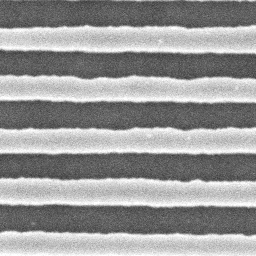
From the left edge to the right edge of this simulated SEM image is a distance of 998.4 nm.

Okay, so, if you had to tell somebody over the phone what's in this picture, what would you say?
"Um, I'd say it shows lines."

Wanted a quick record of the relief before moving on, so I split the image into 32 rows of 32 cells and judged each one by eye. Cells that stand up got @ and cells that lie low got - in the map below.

--------------------------------
--------------------------------
--------------------------------
----@@@@@@@@@@@@@@@@@@@--@@@@@@@
@@@@@@@@@@@@@@@@@@@@@@@@@@@@@@@@
@@@@@@@@@@@@@@@@@@@@@@@@@@@@@@@@
-----------------------@@--@@@@@
--------------------------------
--------------------------------
@@-@-@@---------@---------------
@@@@@@@@@@@@@@@@@@@@@@@@@@@@@@@@
@@@@@@@@@@@@@@@@@@@@@@@@@@@@@@@@
------@@@@@@@@-@@@@@@@@@@@@@@@@@
--------------------------------
--------------------------------
--------------------------------
@@@@@@@@@@@@@@@@@@@@@@@@@@@@@@@@
@@@@@@@@@@@@@@@@@@@@@@@@@@@@@@@@
@@@@@@@@@@@@@@@@@@@@@@@@@@@@@@@@
--------------------------------
--------------------------------
--------------------------------
@@@@@@@@-@@@@@@@@@@@----@-------
@@@@@@@@@@@@@@@@@@@@@@@@@@@@@@@@
@@@@@@@@@@@@@@@@@@@@@@@@@@@@@@@@
----@----@@@@@@@@@@@@@@@@@@@@@@@
--------------------------------
--------------------------------
--------------------------------
@@@@@@@@@@@@@@@@@@@@@@@@@@@@@@@@
@@@@@@@@@@@@@@@@@@@@@@@@@@@@@@@@
@@@@@@@@@@@@@@@@@@@@@@@@@@@@@@@@